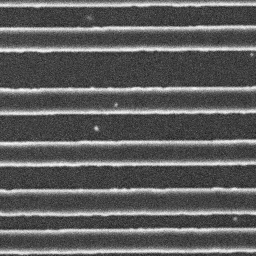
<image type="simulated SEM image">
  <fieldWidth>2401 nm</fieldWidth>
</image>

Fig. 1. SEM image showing lines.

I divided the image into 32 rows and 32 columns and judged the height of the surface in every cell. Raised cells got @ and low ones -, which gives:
@@@@@@@@@@@@@@@@@@@@@@@@@@@@@@@@
--------------------------------
--------------------------------
-------------@@@@@@@@@@@@@@@@@@@
@@@@@@@@@@@@@@@@@@@@@@@@@@@@@@@@
@@@@@@@@@@@@@@@@@@@@@@@@@@@@@@@@
--------------------------------
--------------------------------
--------------------------------
--------------------------------
--------------------------------
@@@@@@@@@@@@@@@@@@@@@@@@@@@@@@@@
@@@@@@@@@@@@@@@@@@@@@@@@@@@@@@@@
@@@@@@@@@@@@@@@@@@@@@@@@@@@@@@@@
--------------------------------
--------------------------------
--------------------------------
--------------------------------
@@@@@@@@@@@@@@@@@@@@@@@@@@@@@@@@
@@@@@@@@@@@@@@@@@@@@@@@@@@@@@@@@
@@@@@@@@@@@@@@@@@@@@@@@@@@@@----
--------------------------------
--------------------------------
--------------------------------
@@@@@@@@@@@@@@@@@@@@@@@@@@@@@@@@
@@@@@@@@@@@@@@@@@@@@@@@@@@@@@@@@
@@@@@@@@@@@@@@@@@@@@@@@@@@@@@@@@
--------------------------------
--------------------------------
@@@@@@@@@@@@@@@@@@@@@@@@@@@@@@@@
@@@@@@@@@@@@@@@@@@@@@@@@@@@@@@@@
@@@@@@@@@@@@--------------------